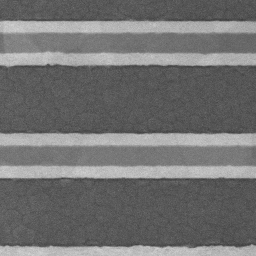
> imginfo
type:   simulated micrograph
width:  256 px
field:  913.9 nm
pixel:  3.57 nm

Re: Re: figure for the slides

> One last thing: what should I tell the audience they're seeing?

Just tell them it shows one or a few lines or trenches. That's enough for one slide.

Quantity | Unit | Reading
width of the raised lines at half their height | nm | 110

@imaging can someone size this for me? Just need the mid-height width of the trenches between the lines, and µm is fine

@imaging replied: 0.291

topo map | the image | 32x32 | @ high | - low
--------------------------------
--------------------------------
--------------------------------
@@@@@-@@@@@--@-@@---@--@@@@@@@-@
@@@@@@@@@@@@@@@@@@@@@@@@@@@@@@@@
@@@@@@@@@@@@@@@@@@@@@@@@@@@@@@@@
@@@@@@@@@@@@@@@@@@@@@@@@@@@@@@@@
--------------------------------
--------------------------------
--------------------------------
--------------------------------
--------------------------------
--------------------------------
--------------------------------
--------------------------------
--------------------------------
--------------------------------
@@--@@@@-@-@-@@-@@@@@@-@@-@--@@@
@@@@@@@@@@@@@@@@@@@@@@@@@@@@@@@@
@@@@@@@@@@@@@@@@@@@@@@@@@@@@@@@@
@@@@@@@@@@@@@@@@@@@@@@@@@@@@@@@@
@-----------------@----------@-@
--------------------------------
--------------------------------
--------------------------------
--------------------------------
--------------------------------
--------------------------------
--------------------------------
--------------------------------
--------------------------------
--------------------------------